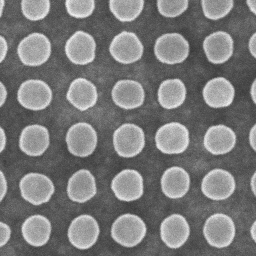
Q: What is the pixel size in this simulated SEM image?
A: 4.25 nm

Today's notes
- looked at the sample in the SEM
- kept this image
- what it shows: a regular array of raised bodies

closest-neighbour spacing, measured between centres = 45 pixels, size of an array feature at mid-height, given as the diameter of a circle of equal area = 131 nm